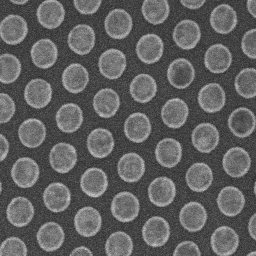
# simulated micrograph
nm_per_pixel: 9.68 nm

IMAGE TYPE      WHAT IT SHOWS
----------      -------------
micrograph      a regular array of raised bodies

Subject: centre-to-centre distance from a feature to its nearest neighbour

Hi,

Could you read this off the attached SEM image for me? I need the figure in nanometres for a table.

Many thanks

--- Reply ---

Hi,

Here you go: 381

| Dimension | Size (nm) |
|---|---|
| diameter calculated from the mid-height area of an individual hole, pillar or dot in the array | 255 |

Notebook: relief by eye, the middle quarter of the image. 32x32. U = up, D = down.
DDUUDDDDDUUUUUUDDDDDDDDDDDDUUUUU
DUUUUDDDDUUUUUUDDDDDDDDDDDUUUUUU
UUUUUUDDDDUUUUDDDDDDDDDDDDUUUUUU
UUUUUUDDDDDDUDDDDDUUUUDDDDUUUUUU
UUUUUUDDDDDDDDDDDUUUUUDDDDDUUUUU
UUUUUDDDDDDDDDDDDUUUUUUDDDDDUUDD
DUUUDDDDDDUDDDDDDUUUUUUDDDDDDDDD
DDDDDDDDUUUUUDDDDUUUUUDDDDDDDDDD
DDDDDDDDUUUUUDDDDDUUUUDDDDDDDDDD
DDDDDDDDUUUUUDDDDDDDDDDDDDUUUUDD
UUUDDDDDUUUUUDDDDDDDDDDDDUUUUUDD
UUUUDDDDUUUUUDDDDDDDDDDDDUUUUUUD
UUUUDDDDDUUUDDDDDDDDDDDDDUUUUUUD
UUUUDDDDDDDDDDDDUUUUDDDDDUUUUUDD
UUUUDDDDDDDDDDDDUUUUUDDDDUUUUUDD
UUUUDDDDDDDDDDDUUUUUUDDDDDUUUDDD
UUUDDDDDUUDDDDDUUUUUUDDDDDDDDDDD
DDDDDDDUUUUUDDDDUUUUUDDDDDDDDDDD
DDDDDDUUUUUUDDDDUUUUDDDDDDDDDDDD
DDDDDDUUUUUUDDDDDDDDDDDDUUUUDDDD
UUDDDDUUUUUUDDDDDDDDDDDDUUUUUDDD
UUDDDDDUUUUUDDDDDDDDDDDUUUUUUDDD
UUUDDDDUUUUDDDDDDDDDDDDUUUUUUDDD
UUUDDDDDDDDDDDDUUUUDDDDUUUUUUDDD
UUUDDDDDDDDDDDUUUUUUDDDDUUUUDDDD
UUDDDDDDDDDDDDUUUUUUDDDDDUUDDDDD
UDDDDDUUUDDDDDUUUUUUDDDDDDDDDDDU
DDDDDUUUUUDDDDUUUUUDDDDDDDDDDDDU
DDDDDUUUUUDDDDDUUUUDDDDDDDDDDDDU
DDDDUUUUUUUDDDDDDDDDDDUUUUUDDDDU
DDDDUUUUUUDDDDDDDDDDDDUUUUUDDDDU
UDDDDUUUUUDDDDDDDDDDDUUUUUUUDDDD